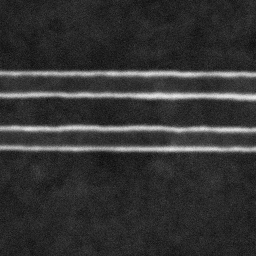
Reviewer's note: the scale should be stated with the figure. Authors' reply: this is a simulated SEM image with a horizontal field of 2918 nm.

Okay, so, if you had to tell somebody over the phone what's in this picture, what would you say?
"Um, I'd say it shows lines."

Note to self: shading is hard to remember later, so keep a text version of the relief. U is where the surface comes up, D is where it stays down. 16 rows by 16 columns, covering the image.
DDDDDDDDDDDDDDDD
DDDDDDDDDDDDDDDD
DDDDDDDDDDDDDDDD
DDDDDDDDDDDDDDDD
DDDDDDDDDDDDDDDD
UUUUUUUUUUUUUUUU
UUUUUUUUUUUUUUUU
UUUUUUUUUUUUUUUU
UUUUUUUUUUUUUUUU
DDDDDDDDDDDDDDDD
DDDDDDDDDDDDDDDD
DDDDDDDDDDDDDDDD
DDDDDDDDDDDDDDDD
DDDDDDDDDDDDDDDD
DDDDDDDDDDDDDDDD
DDDDDDDDDDDDDDDD